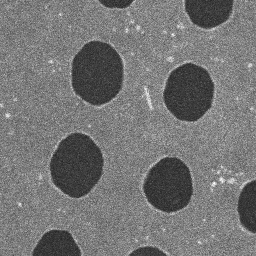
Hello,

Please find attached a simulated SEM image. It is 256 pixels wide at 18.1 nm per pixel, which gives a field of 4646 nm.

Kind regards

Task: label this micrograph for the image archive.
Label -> holes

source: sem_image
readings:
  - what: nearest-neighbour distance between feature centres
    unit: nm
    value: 1710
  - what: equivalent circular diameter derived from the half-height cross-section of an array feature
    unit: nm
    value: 1020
